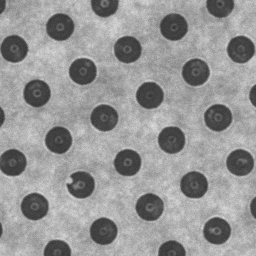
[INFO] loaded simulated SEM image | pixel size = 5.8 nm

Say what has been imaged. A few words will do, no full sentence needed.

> a regular array of ring-shaped grooves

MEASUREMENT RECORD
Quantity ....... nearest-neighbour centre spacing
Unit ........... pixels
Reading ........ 50.2